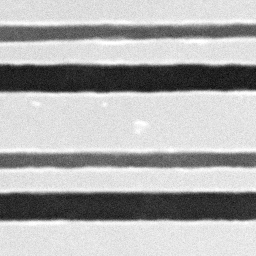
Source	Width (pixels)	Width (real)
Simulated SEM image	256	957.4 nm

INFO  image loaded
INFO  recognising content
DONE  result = lines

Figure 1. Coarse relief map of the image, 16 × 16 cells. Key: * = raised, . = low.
****************
****************
****************
****************
................
................
****************
****************
****************
****************
****************
****************
................
................
****************
****************